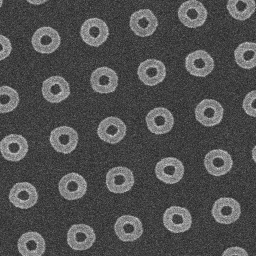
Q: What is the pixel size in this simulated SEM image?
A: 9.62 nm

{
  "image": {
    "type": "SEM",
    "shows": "a regular array of ring-shaped raised bodies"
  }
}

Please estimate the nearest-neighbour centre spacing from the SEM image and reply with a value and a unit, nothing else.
469 nanometres